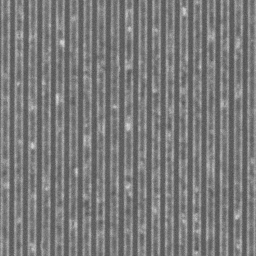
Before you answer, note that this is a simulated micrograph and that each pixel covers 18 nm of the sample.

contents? parallel lines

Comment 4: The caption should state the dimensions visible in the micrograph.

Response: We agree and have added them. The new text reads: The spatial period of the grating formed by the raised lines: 246 nanometers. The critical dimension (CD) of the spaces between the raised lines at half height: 108 nm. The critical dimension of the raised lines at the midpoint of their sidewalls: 0.14 um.